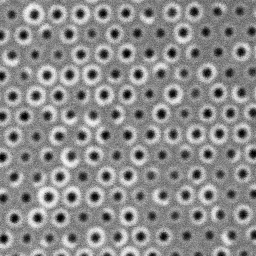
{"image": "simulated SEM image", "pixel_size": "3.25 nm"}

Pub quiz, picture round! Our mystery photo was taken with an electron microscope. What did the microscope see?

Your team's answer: a regular array of holes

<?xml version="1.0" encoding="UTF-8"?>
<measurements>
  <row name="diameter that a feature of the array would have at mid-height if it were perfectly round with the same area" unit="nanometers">35.6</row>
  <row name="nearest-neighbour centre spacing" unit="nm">73.3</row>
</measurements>